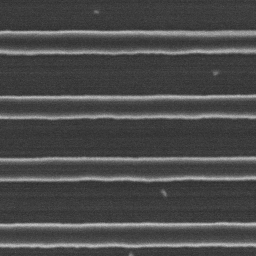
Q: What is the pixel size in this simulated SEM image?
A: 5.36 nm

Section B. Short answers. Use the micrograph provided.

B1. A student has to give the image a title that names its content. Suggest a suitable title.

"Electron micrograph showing lines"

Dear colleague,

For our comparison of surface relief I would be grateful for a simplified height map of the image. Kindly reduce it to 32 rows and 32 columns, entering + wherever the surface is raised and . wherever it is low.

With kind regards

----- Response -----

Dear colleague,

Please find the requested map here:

................................
................................
................................
................................
++++++++++++++++++++++++++++++++
++++++++++++++++++++++++++++++++
++++++++++++++++++++++++........
................................
................................
................................
................................
................................
++++++++++++++++++++++++++++++++
++++++++++++++++++++++++++++++++
++++++++++++++++++++++++++++++++
................................
................................
................................
................................
................................
++++++++++++++++++++++++++++++++
++++++++++++++++++++++++++++++++
++....++..........+.............
................................
................................
................................
................................
................................
++++++++++++++++++++++++++++++++
++++++++++++++++++++++++++++++++
++++++++++++++++++++++++++++++++
................................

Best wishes